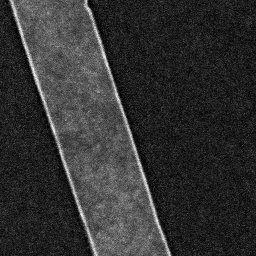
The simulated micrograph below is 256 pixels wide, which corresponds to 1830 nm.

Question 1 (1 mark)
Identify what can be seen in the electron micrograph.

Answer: one or a few lines or trenches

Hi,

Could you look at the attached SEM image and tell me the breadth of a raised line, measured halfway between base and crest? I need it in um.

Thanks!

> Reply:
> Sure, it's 0.513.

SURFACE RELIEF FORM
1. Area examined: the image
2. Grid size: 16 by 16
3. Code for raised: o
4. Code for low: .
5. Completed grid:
.ooooo..........
.ooooo..........
.ooooo..........
..ooooo.........
..ooooo.........
..ooooo.........
...ooooo........
...ooooo........
...ooooo........
....oooo........
....ooooo.......
....ooooo.......
.....oooo.......
.....ooooo......
.....ooooo......
......oooo......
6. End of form